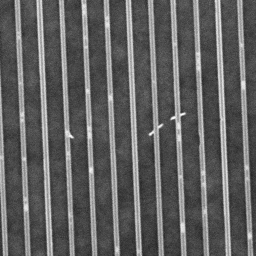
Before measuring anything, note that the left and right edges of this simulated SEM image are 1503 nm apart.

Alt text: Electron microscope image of parallel lines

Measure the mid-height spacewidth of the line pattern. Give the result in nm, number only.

106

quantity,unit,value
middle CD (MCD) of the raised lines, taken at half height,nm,25.7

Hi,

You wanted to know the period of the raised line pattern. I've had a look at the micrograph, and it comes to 130 nm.